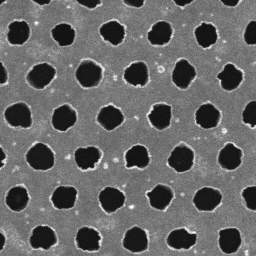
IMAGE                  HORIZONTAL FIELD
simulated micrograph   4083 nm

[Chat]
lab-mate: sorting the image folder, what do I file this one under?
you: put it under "a regular array of holes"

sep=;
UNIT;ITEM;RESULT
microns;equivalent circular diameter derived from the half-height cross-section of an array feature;0.387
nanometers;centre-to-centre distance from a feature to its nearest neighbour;728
